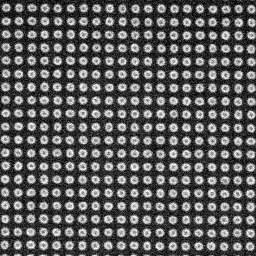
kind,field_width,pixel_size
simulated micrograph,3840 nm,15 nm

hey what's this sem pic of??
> a regular array of raised bodies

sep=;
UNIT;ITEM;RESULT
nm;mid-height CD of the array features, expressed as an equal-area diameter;110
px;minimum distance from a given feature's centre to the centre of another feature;12.7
